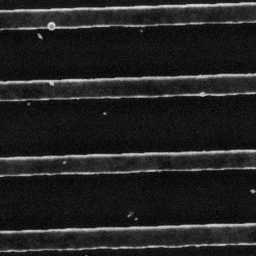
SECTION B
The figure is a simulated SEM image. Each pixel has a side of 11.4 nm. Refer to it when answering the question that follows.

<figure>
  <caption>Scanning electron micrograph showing lines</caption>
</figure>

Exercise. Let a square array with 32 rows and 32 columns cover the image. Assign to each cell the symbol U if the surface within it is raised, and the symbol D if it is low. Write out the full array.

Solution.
DDDDDDDDDDDDDDDDDDDDDDDDDDDDUUUU
UUUUUUUUUUUUUUUUUUUUUUUUUUUUUUUU
UUUUUUUUUUUUUUUUUUUUUUUUUUUUUUUU
UUUUUDUDDDDDDDDDDDDDDDDDDDDDDDDD
DDDDDDDDDDDDDDDDDDDDDDDDDDDDDDDD
DDDDDDDDDDDDDDDDDDDDDDDDDDDDDDDD
DDDDDDDDDDDDDDDDDDDDDDDDDDDDDDDD
DDDDDDDDDDDDDDDDDDDDDDDDDDDDDDDD
DDDDDDDDDDDDDDDDDDDDDDDDDDDDDDDD
DDDDDDDDDDDDDDDDDDDDDDDDDUUUUUUU
UUUUUUUUUUUUUUUUUUUUUUUUUUUUUUUU
UUUUUUUUUUUUUUUUUUUUUUUUUUUUUUUU
UUUDDDDDDDDDDDDDDDDDDDDDDDDDDDDD
DDDDDDDDDDDDDDDDDDDDDDDDDDDDDDDD
DDDDDDDDDDDDDDDDDDDDDDDDDDDDDDDD
DDDDDDDDDDDDDDDDDDDDDDDDDDDDDDDD
DDDDDDDDDDDDDDDDDDDDDDDDDDDDDDDD
DDDDDDDDDDDDDDDDDDDDDDDDDDDDDDDD
DDDDDDDDDDDDDDDDDDDDDDDDDDDDDDDD
DDDDDDDDUUUUUUUUUUUUUUUUUUUUUUUU
UUUUUUUUUUUUUUUUUUUUUUUUUUUUUUUU
UUUUUUUUUUUUUUUUDDDDDDDDDDDDDDDD
DDDDDDDDDDDDDDDDDDDDDDDDDDDDDDDD
DDDDDDDDDDDDDDDDDDDDDDDDDDDDDDDD
DDDDDDDDDDDDDDDDDDDDDDDDDDDDDDDD
DDDDDDDDDDDDDDDDDDDDDDDDDDDDDDDD
DDDDDDDDDDDDDDDDDDDDDDDDDDDDDDDD
DDDDDDDDDDDDDDDDDDDDDDDDDDDDDDDD
DDDDDDDDDDDDDDDDUUUUUUUUUUUUUUUU
UUUUUUUUUUUUUUUUUUUUUUUUUUUUUUUU
UUUUUUUUUUUUUUUUUUUUUUUUUUUUUUUU
DDDDDDDDDDDDDDDDDDDDDDDDDDDDDDDD